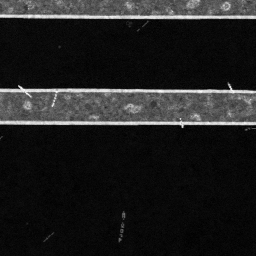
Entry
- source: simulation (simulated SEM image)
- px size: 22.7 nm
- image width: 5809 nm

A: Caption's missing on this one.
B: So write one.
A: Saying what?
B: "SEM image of one or a few lines or trenches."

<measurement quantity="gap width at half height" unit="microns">1.69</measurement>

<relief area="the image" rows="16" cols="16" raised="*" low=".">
****************
................
................
................
................
................
****************
****************
................
................
................
................
................
................
................
................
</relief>